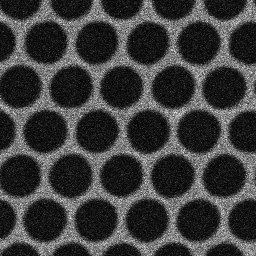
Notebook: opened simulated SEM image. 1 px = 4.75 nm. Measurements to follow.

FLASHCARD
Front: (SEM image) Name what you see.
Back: a regular array of holes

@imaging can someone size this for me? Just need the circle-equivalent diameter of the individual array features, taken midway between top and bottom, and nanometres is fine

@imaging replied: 211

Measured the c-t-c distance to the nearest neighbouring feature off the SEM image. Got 241 nm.